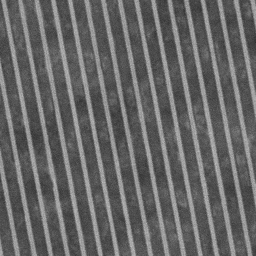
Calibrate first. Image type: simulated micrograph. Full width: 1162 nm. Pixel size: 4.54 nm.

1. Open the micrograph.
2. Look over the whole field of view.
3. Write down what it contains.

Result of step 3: parallel lines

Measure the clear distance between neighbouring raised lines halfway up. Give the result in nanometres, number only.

61.3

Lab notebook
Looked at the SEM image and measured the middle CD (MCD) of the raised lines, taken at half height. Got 15.1 nanometres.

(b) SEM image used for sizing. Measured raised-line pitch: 74 nm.